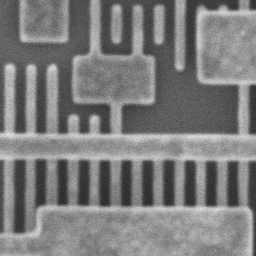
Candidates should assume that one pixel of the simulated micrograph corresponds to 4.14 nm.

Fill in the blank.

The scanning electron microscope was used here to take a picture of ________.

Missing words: wiring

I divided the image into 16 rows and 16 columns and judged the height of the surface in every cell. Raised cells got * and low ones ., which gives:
................
............****
............****
............****
............****
................
................
................
****************
****************
................
................
................
..**************
..**************
****************